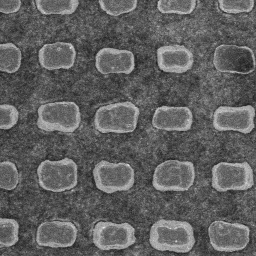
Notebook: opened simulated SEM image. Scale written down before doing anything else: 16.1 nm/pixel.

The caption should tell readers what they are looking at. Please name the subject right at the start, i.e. a regular array of raised bodies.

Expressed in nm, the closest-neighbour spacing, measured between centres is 917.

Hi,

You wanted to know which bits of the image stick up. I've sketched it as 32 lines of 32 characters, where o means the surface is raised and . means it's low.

ooo..oooo...ooooo...oooo....oooo
oo...ooo.....ooo....oooo....oo..
................................
................................
................................
o.....ooo.......................
ooo..oooo...oooo....ooo....ooooo
ooo..oooo...ooooo...oooo...ooooo
oo....oo....ooooo....o.....ooooo
................................
................................
................................
................................
oo...ooooo...oooo...ooo.......o.
oo...ooooo..ooooo..ooooo...oooo.
oo...ooooo..ooooo..ooooo...oooo.
..............oo................
................................
................................
................................
oo...oooo......o....oooo...ooo..
oo...oooo...ooooo..ooooo...oooo.
oo...ooooo..oooo...ooooo...oooo.
oo...oooo....ooo....ooo....oo...
................................
................................
................................
oo..............................
oo...oooo...oooo....oooo..ooooo.
oo...oooo...oooo...ooooo..ooooo.
.....o.oo...oooo...ooooo...oooo.
................................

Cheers